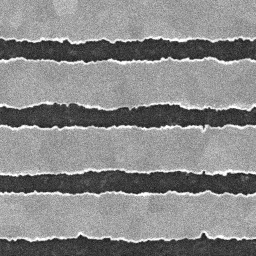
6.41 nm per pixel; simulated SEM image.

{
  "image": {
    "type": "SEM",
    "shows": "one or a few lines or trenches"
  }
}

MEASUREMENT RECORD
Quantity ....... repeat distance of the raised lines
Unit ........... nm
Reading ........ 425